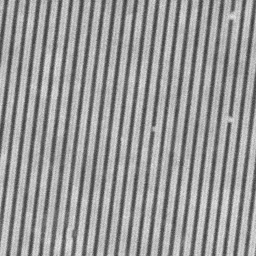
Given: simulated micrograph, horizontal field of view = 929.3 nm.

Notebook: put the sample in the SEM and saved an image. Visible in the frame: parallel lines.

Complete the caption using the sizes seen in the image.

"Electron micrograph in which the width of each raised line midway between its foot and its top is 19.8 nm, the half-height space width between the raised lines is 19.8 nm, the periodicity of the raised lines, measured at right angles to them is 39 nm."